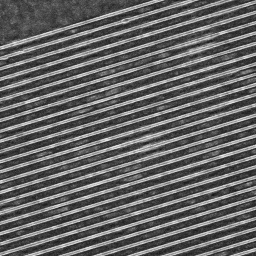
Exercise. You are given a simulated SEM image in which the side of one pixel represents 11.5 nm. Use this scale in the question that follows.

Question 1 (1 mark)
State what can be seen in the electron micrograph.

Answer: parallel lines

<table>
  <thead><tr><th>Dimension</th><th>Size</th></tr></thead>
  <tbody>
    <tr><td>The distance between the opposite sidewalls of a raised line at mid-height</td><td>2.27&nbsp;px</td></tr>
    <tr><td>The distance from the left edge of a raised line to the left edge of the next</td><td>114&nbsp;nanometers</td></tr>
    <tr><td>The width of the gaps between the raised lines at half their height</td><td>87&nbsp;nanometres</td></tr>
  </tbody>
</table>